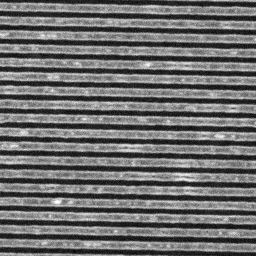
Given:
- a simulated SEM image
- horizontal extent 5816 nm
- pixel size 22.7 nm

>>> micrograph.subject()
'parallel lines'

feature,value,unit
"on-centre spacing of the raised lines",13.9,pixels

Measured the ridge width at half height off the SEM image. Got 162 nanometers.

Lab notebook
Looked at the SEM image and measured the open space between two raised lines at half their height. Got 6.25 pixels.